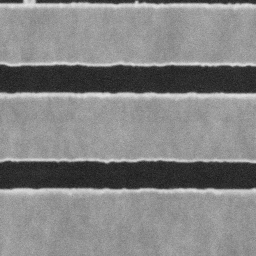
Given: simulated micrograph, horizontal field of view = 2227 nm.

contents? lines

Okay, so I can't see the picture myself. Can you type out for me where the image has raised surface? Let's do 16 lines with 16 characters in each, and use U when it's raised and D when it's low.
UUUUUUUUUUUUUUUU
UUUUUUUUUUUUUUUU
UUUUUUUUUUUUUUUU
UUUUUUUUUUUUUUUU
DDDDDDDDDDDDDDDD
DDDDDDDDDDDDDDDD
UUUUUUUUUUUUUUUU
UUUUUUUUUUUUUUUU
UUUUUUUUUUUUUUUU
UUUUUUUUUUUUUUUU
DDDDDDDDDDDDDDDD
DDDDDDDDDDDDDDDD
UUUUUUUUUUUUUUUU
UUUUUUUUUUUUUUUU
UUUUUUUUUUUUUUUU
UUUUUUUUUUUUUUUU